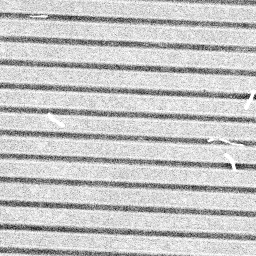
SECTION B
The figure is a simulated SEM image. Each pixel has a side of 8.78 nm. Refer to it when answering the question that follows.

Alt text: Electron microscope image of parallel lines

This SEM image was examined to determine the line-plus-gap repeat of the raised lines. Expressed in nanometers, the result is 206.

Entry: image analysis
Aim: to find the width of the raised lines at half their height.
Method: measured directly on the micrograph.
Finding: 141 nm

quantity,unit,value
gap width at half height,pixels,7.49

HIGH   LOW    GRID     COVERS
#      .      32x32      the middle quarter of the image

...........................#####
#######.........................
##############################..
################################
################################
...........#####################
................................
#########.......................
################################
################################
################################
.............###################
................................
###########.....................
################################
################################
################################
...............#################
................................
#############...................
################################
################################
################################
.................###############
................................
####################............
################################
################################
################################
...................#############
................................
######################..........